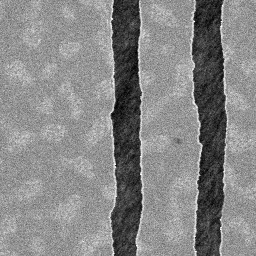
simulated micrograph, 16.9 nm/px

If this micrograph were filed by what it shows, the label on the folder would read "one or a few lines or trenches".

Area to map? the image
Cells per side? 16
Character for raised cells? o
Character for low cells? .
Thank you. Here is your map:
ooooooo..ooo..oo
ooooooo..ooo..oo
ooooooo..ooo..oo
ooooooo..ooo..oo
ooooooo..ooo..oo
ooooooo..ooo..oo
ooooooo..ooo..oo
ooooooo..ooo..oo
ooooooo..ooo..oo
ooooooo..oooo.oo
ooooooo..ooo..oo
ooooooo..ooo..oo
ooooooo..ooo..oo
ooooooo..ooo..oo
ooooooo..ooo..oo
ooooooo..ooo..oo